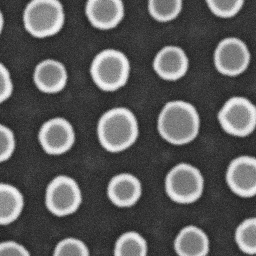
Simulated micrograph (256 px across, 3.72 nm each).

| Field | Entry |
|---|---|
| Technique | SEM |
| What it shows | a regular array of raised bodies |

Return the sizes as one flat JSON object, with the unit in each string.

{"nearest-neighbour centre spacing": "224 nanometres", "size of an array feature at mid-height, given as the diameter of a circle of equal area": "0.124 µm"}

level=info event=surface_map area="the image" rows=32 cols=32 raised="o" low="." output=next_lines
....ooo....oooo....ooo....oooo..
...ooooo...oooo....ooo.....oo...
...ooooo...oooo.................
....ooo.........................
................................
............................oo..
....................ooo....oooo.
............oooo....ooo....oooo.
.....ooo....oooo....ooo....ooo..
o....ooo....oooo....oo..........
o....ooo....ooo.................
o...............................
.............................o..
.....................ooo....oooo
.............ooo....ooooo...oooo
......oo....ooooo...ooooo...oooo
o....oooo...ooooo...ooooo....oo.
oo...oooo....oooo....ooo........
oo....oo.....oo.................
o...............................
.............................ooo
......................oo.....ooo
.......oo.....ooo....oooo....ooo
o.....oooo....ooo....oooo....ooo
oo....oooo....ooo....oooo.......
ooo...oooo.....o................
oo.....oo.......................
o...............................
..............................oo
................o.....ooo.....oo
.o......oo.....ooo....oooo....oo
ooo....oooo....ooo....oooo......